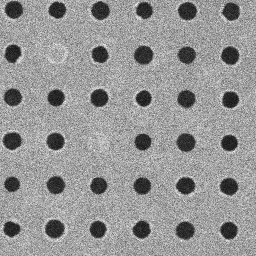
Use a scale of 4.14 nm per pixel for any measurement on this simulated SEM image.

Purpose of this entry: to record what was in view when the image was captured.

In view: a regular array of holes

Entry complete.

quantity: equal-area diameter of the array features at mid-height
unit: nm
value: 71.9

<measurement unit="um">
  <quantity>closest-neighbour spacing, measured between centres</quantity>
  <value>0.179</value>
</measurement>